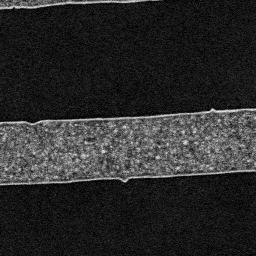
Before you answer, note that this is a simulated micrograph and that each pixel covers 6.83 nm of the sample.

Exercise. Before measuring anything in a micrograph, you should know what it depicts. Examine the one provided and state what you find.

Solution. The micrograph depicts one or a few lines or trenches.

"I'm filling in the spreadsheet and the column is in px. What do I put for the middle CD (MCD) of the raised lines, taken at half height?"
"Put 62.5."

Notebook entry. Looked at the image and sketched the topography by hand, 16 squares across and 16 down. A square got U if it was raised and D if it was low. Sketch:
UUDDDDDDDDDDDDDD
DDDDDDDDDDDDDDDD
DDDDDDDDDDDDDDDD
DDDDDDDDDDDDDDDD
DDDDDDDDDDDDDDDD
DDDDDDDDDDDDDDDD
DDDDDDDDDDDDDDDD
DDDDDUUUUUUUUUUU
UUUUUUUUUUUUUUUU
UUUUUUUUUUUUUUUU
UUUUUUUUUUUUUUUU
UDDDDDDDDDDDDDDD
DDDDDDDDDDDDDDDD
DDDDDDDDDDDDDDDD
DDDDDDDDDDDDDDDD
DDDDDDDDDDDDDDDD